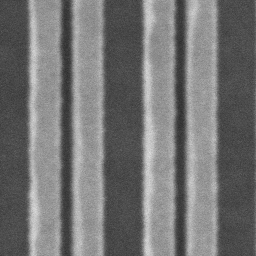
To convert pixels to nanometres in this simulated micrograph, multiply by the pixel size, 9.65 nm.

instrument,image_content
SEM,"lines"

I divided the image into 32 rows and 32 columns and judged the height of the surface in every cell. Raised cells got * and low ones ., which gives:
....****.****.....****..***.....
....***..****.....****..***.....
....***..****.....****..***.....
....***..****.....****..***.....
....***..****.....****..***.....
....***..****.....****..***.....
....***..****.....****..***.....
....****.****.....****..***.....
....****.****.....****..***.....
....****.****.....****..***.....
....***..****.....****.****.....
....***..****.....****.****.....
....****.****.....****.****.....
....***..****.....****..***.....
....***..****.....****..***.....
....***..****.....****..***.....
....***..****.....****..***.....
....***...***.....****..***.....
....***...***.....****..***.....
....***...***.....****..***.....
....****.****.....****..***.....
....***..****.....****..***.....
....***..****.....****..***.....
....***..****.....****..***.....
....***..****.....****..***.....
....***..****.....****..***.....
....***..****.....****..***.....
....***..****.....****..***.....
....***..****.....****..***.....
....***...***.....****..***.....
....***..****.....****..***.....
....***..****.....****..***.....